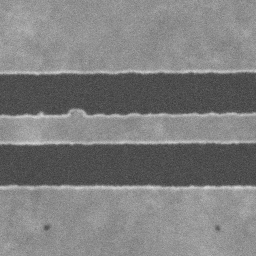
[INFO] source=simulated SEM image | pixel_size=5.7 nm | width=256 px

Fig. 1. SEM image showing lines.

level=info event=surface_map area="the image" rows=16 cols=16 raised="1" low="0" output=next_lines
1111111111111111
1111111111111111
1111111111111111
1111111111111111
1111111111111110
0000000000000000
0000000000000000
1111111111111111
1111111111111111
0000000000000000
0000000000000000
0000000000000000
1111111111111111
1111111111111111
1111111111111111
1111111111111111